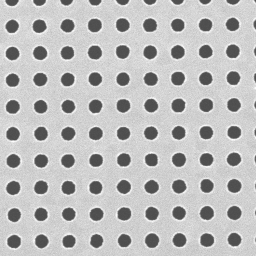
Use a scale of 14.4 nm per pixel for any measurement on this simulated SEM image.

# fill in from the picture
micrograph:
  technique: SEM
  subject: a regular array of holes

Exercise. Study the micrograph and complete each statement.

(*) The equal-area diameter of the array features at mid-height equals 204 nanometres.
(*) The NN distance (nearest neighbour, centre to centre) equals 0.384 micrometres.